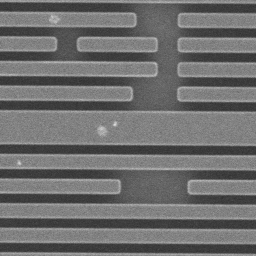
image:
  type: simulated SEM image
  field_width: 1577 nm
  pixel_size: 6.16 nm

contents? groups of lines, slits or small figures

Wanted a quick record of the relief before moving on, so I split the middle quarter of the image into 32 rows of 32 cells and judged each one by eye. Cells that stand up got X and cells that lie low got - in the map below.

XXXXXXXXXXXXXXXXXXXXXXX------XXX
XXXXXXXXXXXXXXXXXXXXXXX------XXX
XXXXXXXXXXXXXXXXXXXXXXX------XXX
--------------------------------
--------------------------------
--------------------------------
XXXXXXXXXXXXXXXXX-----------XXXX
XXXXXXXXXXXXXXXXX-----------XXXX
XXXXXXXXXXXXXXXXX-----------XXXX
--------------------------------
--------------------------------
--------------------------------
XXXXXXXXXXXXXXXXXXXXXXXXXXXXXXXX
XXXXXXXXXXXXXXXXXXXXXXXXXXXXXXXX
XXXXXXXXXXXXXXXXXXXXXXXXXXXXXXXX
XXXXXXXXXXXXXXXXXXXXXXXXXXXXXXXX
XXXXXXXXXXXXXXXXXXXXXXXXXXXXXXXX
XXXXXXXXXXXXXXXXXXXXXXXXXXXXXXXX
XXXXXXXXXXXXXXXXXXXXXXXXXXXXXXXX
XXXXXXXXXXXXXXXXXXXXXXXXXXXXXXXX
--------------------------------
--------------------------------
--------------------------------
XXXXXXXXXXXXXXXXXXXXXXXXXXXXXXXX
XXXXXXXXXXXXXXXXXXXXXXXXXXXXXXXX
XXXXXXXXXXXXXXXXXXXXXXXXXXXXXXXX
--------------------------------
--------------------------------
--------------------------------
XXXXXXXXXXXXXX-----------------X
XXXXXXXXXXXXXX-----------------X
XXXXXXXXXXXXXX-----------------X